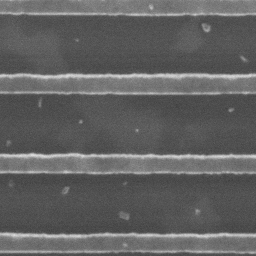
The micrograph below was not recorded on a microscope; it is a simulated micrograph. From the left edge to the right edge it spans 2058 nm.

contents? lines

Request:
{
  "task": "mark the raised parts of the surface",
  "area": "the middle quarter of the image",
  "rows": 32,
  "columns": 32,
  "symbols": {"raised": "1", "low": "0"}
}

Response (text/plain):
00000000000000000000000000000000
00000000000000000000000000000000
00000000000000000000000000000000
11111111111111111111111111111111
11111111111111111111111111111111
11111111111111111111111111111111
11111111111111111111111111111111
00000000000000000000000000000000
00000000000000000000000000000000
00000000000000000000000000000000
00000000000000000000000000000000
00000000000000000000000000000000
00000000000000000000000000000000
00000000000000000000000000000000
00000000000000000000000000000000
00000000000000000000000000000000
00000000000000000000000000000000
00000000000000000000000000000000
00000000000000000000000000000000
00000000000000000000000000000000
00000000000000000000000000000000
00000000000000000000000000000000
01110000000000000000000000000000
11111111111111111111111111111111
11111111111111111111111111111111
11111111111111111111111111111111
11111111111111111111111111111111
00000000000000000000000000000000
00000000000000000000000000000000
00000000000000000000000000000000
00000000000000000000000000000000
00000000000000000000000000000000